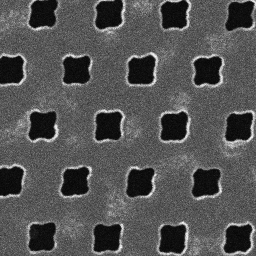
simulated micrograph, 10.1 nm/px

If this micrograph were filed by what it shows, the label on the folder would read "a regular array of holes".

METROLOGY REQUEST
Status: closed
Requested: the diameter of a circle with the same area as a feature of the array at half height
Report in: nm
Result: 294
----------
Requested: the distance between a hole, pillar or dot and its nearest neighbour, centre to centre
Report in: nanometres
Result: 647